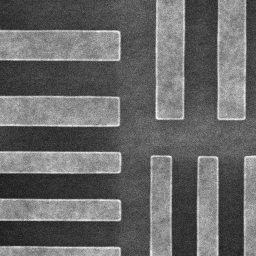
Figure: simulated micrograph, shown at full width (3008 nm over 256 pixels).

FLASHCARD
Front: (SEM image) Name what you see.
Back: groups of lines, slits or small figures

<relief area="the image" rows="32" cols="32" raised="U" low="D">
DDDDDDDDDDDDDDDDDDDDUUUDDDDUUUUD
DDDDDDDDDDDDDDDDDDDDUUUDDDDUUUUD
DDDDDDDDDDDDDDDDDDDDUUUDDDDUUUUD
DDDDDDDDDDDDDDDDDDDDUUUDDDDUUUUD
UUUUUUUUUUUUUUUDDDDDUUUDDDDUUUUD
UUUUUUUUUUUUUUUDDDDDUUUDDDDUUUUD
UUUUUUUUUUUUUUUDDDDDUUUDDDDUUUUD
DDDDDDDDDDDUUUUDDDDDUUUDDDDUUUUD
DDDDDDDDDDDDDDDDDDDDUUUDDDDUUUUD
DDDDDDDDDDDDDDDDDDDDUUUDDDDUUUUD
DDDDDDDDDDDDDDDDDDDDUUUDDDDUUUUD
DDDDDDDDDDDDDDDDDDDDUUUDDDDUUUUD
UUUUUUUUUUUUUUUDDDDDUUUDDDDUUUUD
UUUUUUUUUUUUUUUDDDDDUUUDDDDUUUUD
UUUUUUUUUUUUUUUDDDDDUUUDDDDUUUUD
UUUUUUUUUUUUUUUDDDDDDDDDDDDDDDDD
DDDDDDDDDDDDDDDDDDDDDDDDDDDDDDDD
DDDDDDDDDDDDDDDDDDDDDDDDDDDDDDDD
DDDDDDDDDDDDDDDDDDDDDDDDDDDDDDDD
UUUUUUUUUUUUUUUDDDDDDDDDDDDDDDDD
UUUUUUUUUUUUUUUDDDDUUDDDDUUDDDDU
UUUUUUUUUUUUUUUDDDDUUDDDDUUDDDDU
DDDDDDDDDDDDDDDDDDDUUDDDDUUDDDDU
DDDDDDDDDDDDDDDDDDDUUDDDDUUDDDDU
DDDDDDDDDDDDDDDDDDDUUDDDDUUDDDDU
UUUUUUUUUUUUUUUDDDDUUDDDDUUDDDDU
UUUUUUUUUUUUUUUDDDDUUDDDDUUDDDDU
DDDDDDDDDUUUUUUDDDDUUDDDDUUDDDDU
DDDDDDDDDDDDDDDDDDDUUDDDDUUDDDDU
DDDDDDDDDDDDDDDDDDDUUDDDDUUDDDDU
DDDDDDDDDDDDDDDDDDDUUDDDDUUDDDDU
UUUUUUUUUUUUUUUDDDDUUDDDDUUDDDDU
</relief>